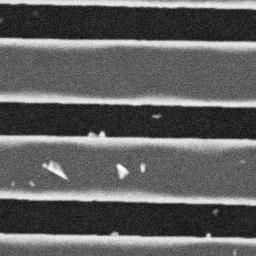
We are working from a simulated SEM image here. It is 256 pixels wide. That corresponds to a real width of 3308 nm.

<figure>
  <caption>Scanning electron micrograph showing lines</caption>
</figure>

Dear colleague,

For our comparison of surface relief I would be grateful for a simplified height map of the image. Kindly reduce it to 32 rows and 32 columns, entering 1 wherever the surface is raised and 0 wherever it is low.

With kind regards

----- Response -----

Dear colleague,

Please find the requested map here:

00000000000000011111111111111111
00000000000000000000000000000000
00000000000000000000000000000000
00000000000000000000000000000000
00000000000000000000000000000000
11111111111111111111111111111111
11111111111111111111111111111111
11111111111111111111111111111111
11111111111111111111111111111111
11111111111111111111111111111111
11111111111111111111111111111111
11111111111111111111111111111111
11011111111111111111111111111111
00000000000000000000000000000000
00000000000000000000000000000000
00000000000000000000000000000000
00000000000000000000000000000000
11111111111111111111100000000000
11111111111111111111111111111111
11111111111111111111111111111111
11111111111111111111111111111111
11111111111111111111111111111111
11111111111111111111111111111111
11111111111111111111111111111111
11111111111111111111111111111111
00000000000000000000000000000001
00000000000000000000000000000000
00000000000000000000000000000000
00000000000000000000000000000000
10000000000000000000000000000000
11111111111111111111111111111111
11111111111111111111111111111111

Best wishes